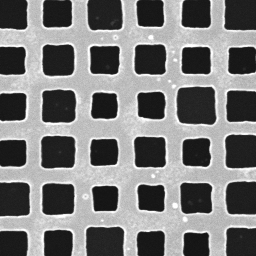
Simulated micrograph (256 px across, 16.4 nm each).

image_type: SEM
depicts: a regular array of holes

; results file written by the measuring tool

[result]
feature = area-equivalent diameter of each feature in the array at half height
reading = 544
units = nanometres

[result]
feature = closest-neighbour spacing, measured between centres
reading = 747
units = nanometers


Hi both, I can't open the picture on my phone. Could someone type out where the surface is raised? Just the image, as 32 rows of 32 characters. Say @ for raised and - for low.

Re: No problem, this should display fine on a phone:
---@@----@@----@@---@@@---@@----
---@@----@@----@@----@@---@@----
---@@----@@----@@----@@---@@----
---@@@@@@@@----@@@@@@@@@--@@----
@@@@@@@@@@@@@@@@@@@@@@@@@@@@@@@@
@@@@@@@@@@@@@@@@@@@@@@@@@@@@@@@@
---@@----@@----@@----@@---@@@---
---@@----@@----@@----@@---@@@---
---@@----@@----@@----@@---@@----
@@@@@@@-@@@@@@@@@@@@@@@@@@@@@@@@
@@@@@@@@@@@@@@@@@@@@@@@@@@@@@@@@
@@@@@@---@@@@@@@@@@-@@-----@@---
---@@----@@----@@----@-----@----
---@@-----@----@@----@-----@----
---@@----@@---@@@@---@-----@----
@@@@@@@@@@@@@@@@@@@@@@@----@@@@@
@@@@@@@@@@@@@@@@@@@@@@@@@@@@@@@@
@--@@----@@@--@@@----@@---@@----
---@@----@@----@@----@@---@@----
---@@----@@----@@----@@---@@----
---@@----@@@--@@@----@@---@@----
@@@@@@@@@@@@@@@@@@@@@@@@@@@@@@@@
@@@@@@@@@@@@@@@@@@@@@@@@@@@@@@@@
----@----@@@---@@---@@@---@@----
----@----@@@---@@----@@---@@----
----@----@@@---@@----@@---@@----
----@----@@@@@@@@@@@@@@---@@@---
@@@@@@@@@@@@@@@@@@@@@@@@@@@@@@@@
@@@@@@@@@@@----@@@@@@@@@@@@@@--@
---@@----@@----@@----@@---@@----
----@----@@----@@----@@---@@----
---@@@---@@----@@----@@---@@----